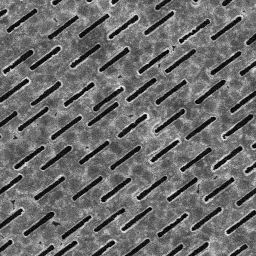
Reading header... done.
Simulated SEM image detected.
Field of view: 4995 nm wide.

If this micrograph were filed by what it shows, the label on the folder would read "a regular array of holes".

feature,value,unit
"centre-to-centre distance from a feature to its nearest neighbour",586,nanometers